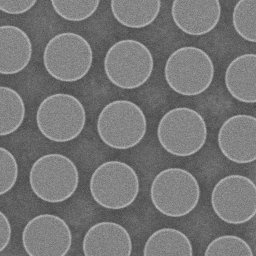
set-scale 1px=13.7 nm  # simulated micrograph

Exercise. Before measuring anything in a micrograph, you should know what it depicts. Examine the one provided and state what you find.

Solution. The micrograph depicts an array of small figures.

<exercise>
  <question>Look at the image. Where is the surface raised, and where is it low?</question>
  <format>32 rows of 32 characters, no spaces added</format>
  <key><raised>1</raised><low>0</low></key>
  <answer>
11110001111100111111001111100011
01100001111100111111001111100111
00000000010000011110001111100111
11000000000000000000000111100111
11100001110000000000000000000011
11110011111000011100000000000000
11110011111000111110001110000000
11110011111001111110011111000111
11100011111001111110011111100111
00000001110001111110011111101111
00000000000000111100011111001111
11000000000000000000001110000111
11100011110000000000000000000011
11100111110001111000000000000000
11100111111011111100011110000010
11100111110011111100111111001111
10000111110011111100111111011111
00000001100001111000111111011111
00000000000000010000011110001111
11000011000000000000000000001111
11001111100001110000000000000000
11001111110011111000111000000000
11001111110111111001111100001110
10001111100111111001111110011111
00000111100011111001111110111111
00000000000001110001111100011111
00000000000000000000111100011111
10001111000000000000000000001110
10011111100111100000000000000000
10011111100111110001111000001000
10011111101111110011111100111110
00011111000111110011111100111110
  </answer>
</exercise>